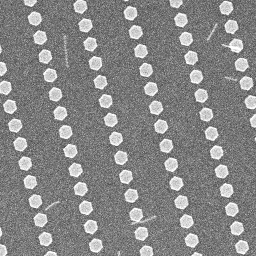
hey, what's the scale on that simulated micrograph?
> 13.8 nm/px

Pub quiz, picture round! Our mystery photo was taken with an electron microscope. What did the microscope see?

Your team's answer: a regular array of raised bodies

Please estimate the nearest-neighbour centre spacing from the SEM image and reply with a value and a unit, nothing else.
270 nm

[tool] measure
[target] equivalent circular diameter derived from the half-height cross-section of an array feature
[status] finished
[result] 177 nm